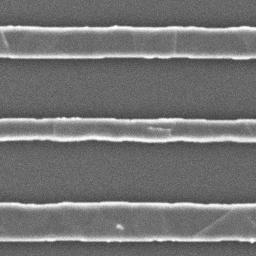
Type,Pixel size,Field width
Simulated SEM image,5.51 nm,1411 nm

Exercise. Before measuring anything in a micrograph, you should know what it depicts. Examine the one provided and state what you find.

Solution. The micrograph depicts lines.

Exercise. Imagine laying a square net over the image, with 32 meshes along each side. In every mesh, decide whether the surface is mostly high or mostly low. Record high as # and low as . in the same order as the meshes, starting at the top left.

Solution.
................................
................................
................................
####..........##.....#........#.
################################
################################
################################
................................
................................
................................
................................
................................
................................
................................
................................
################################
################################
..................###...........
................................
................................
................................
................................
................................
................................
................................
##.....###.#########...#........
################################
################################
################################
################################
................................
................................